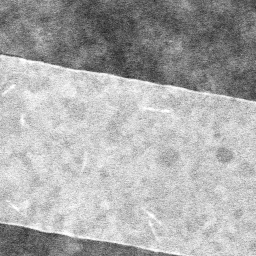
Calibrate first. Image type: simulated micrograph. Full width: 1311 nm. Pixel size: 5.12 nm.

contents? one or a few lines or trenches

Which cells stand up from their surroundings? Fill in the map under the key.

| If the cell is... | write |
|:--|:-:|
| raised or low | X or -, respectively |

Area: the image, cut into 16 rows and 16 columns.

----------------
----------------
----------------
X---------------
XXXXX-----------
XXXXXXXXXXX-----
XXXXXXXXXXXXXXXX
XXXXXXXXXXXXXXXX
XXXXXXXXXXXXXXXX
XXXXXXXXXXXXXXXX
XXXXXXXXXXXXXXXX
XXXXXXXXXXXXXXXX
XXXXXXXXXXXXXXXX
XXXXXXXXXXXXXXXX
---XXXXXXXXXXXXX
---------XXXXXXX